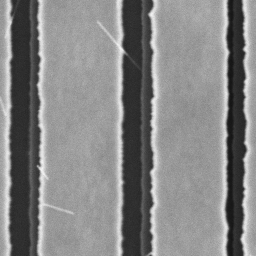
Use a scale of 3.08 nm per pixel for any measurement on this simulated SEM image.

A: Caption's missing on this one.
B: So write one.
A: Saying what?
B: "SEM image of lines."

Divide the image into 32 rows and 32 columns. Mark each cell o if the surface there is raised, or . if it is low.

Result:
o....oooooooooo....ooooooooo..oo
o....oooooooooo....ooooooooo..oo
oo...oooooooooo....ooooooooo...o
o....oooooooooo....ooooooooo..oo
o....oooooooooo....ooooooooo..oo
o....oooooooooo....ooooooooo...o
o....ooooooooooo...oooooooooo..o
o....oooooooooo....ooooooooo..oo
o....oooooooooo....ooooooooo...o
o....oooooooooo....ooooooooo...o
o....oooooooooo....ooooooooo...o
o....oooooooooo....oooooooooo.oo
o....oooooooooo....ooooooooo...o
o....oooooooooo....oooooooooo.oo
o....oooooooooo....ooooooooo...o
o....oooooooooo....ooooooooo...o
o....oooooooooo....ooooooooo...o
o....oooooooooo....ooooooooo...o
o....oooooooooo....ooooooooo...o
o....oooooooooo....ooooooooo...o
o....oooooooooo....ooooooooo...o
o....oooooooooo....ooooooooo...o
o....oooooooooo....ooooooooo..oo
o....oooooooooo....ooooooooo..oo
o....oooooooooo....ooooooooo..oo
o....oooooooooo....ooooooooo..oo
o....oooooooooo....ooooooooo..oo
o....oooooooooo....ooooooooo..oo
o....oooooooooo....oooooooooo.oo
o....oooooooooo....ooooooooo..oo
o....oooooooooo....ooooooooo..oo
o....oooooooooo....ooooooooo..oo